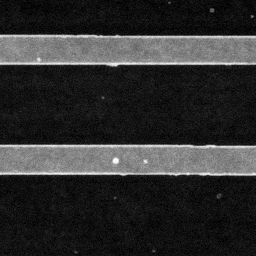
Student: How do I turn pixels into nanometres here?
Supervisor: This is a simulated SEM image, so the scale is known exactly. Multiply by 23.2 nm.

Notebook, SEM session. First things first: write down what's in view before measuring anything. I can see lines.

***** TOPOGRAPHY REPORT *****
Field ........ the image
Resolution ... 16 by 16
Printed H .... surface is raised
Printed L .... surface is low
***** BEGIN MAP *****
LLLLLLLLLLLLLLLL
LLLLLLLLLLLLLLLL
HHHHHHHHHHHHHHHH
HHHHHHHHHHHHHHHH
LLLLLLLLLLLLLLLL
LLLLLLLLLLLLLLLL
LLLLLLLLLLLLLLLL
LLLLLLLLLLLLLLLL
LLLLLLLLLLLLLLLL
HHHHHHHHHHHHHHHH
HHHHHHHHHHHHHHHH
LLLLLLLLLLLLLLLL
LLLLLLLLLLLLLLLL
LLLLLLLLLLLLLLLL
LLLLLLLLLLLLLLLL
LLLLLLLLLLLLLLLL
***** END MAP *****